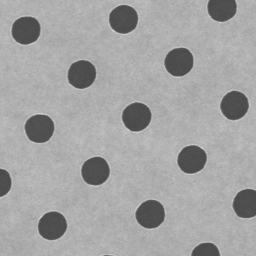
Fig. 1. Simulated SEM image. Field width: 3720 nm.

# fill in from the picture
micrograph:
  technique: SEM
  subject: a regular array of holes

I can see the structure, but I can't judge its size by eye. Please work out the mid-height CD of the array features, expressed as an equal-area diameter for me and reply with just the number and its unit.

424 nanometers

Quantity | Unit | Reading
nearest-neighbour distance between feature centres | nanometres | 998